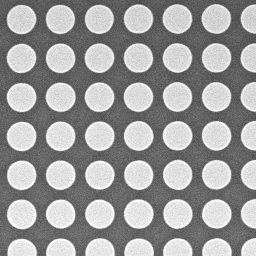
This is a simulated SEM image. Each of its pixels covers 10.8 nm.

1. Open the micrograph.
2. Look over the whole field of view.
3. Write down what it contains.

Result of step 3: an array of small figures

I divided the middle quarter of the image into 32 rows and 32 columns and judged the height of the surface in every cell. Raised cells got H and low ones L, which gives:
HHLLLLHHHHHHLLLLHHHHHHLLLHHHHHHL
HLLLLLLHHHHLLLLLLHHHHLLLLLHHHHLL
LLLLLLLLLLLLLLLLLLLLLLLLLLLLLLLL
LLLLLLLLLLLLLLLLLLLLLLLLLLLLLLLL
LLLLLLLLLLLLLLLLLLLLLLLLLLLLLLLL
HLLLLLLHHHHLLLLLHHHHHLLLLLHHHHHL
HHLLLLHHHHHHLLLLHHHHHHLLLHHHHHHL
HHHLLHHHHHHHLLLHHHHHHHLLLHHHHHHH
HHHLLHHHHHHHLLLHHHHHHHLLLHHHHHHH
HHHLLLHHHHHHLLLHHHHHHHLLLHHHHHHH
HHLLLLHHHHHHLLLLHHHHHLLLLLHHHHHL
HLLLLLLHHHLLLLLLLHHHLLLLLLLHHHLL
LLLLLLLLLLLLLLLLLLLLLLLLLLLLLLLL
LLLLLLLLLLLLLLLLLLLLLLLLLLLLLLLL
LLLLLLLLLLLLLLLLLLLLLLLLLLLLLLLL
HHLLLLHHHHHLLLLLHHHHHLLLLLHHHHHL
HHLLLLHHHHHHLLLHHHHHHHLLLHHHHHHH
HHHLLHHHHHHHLLLHHHHHHHLLLHHHHHHH
HHHLLHHHHHHHLLLHHHHHHHLLLHHHHHHH
HHLLLLHHHHHHLLLHHHHHHHLLLHHHHHHH
HHLLLLHHHHHHLLLLHHHHHLLLLLHHHHHL
LLLLLLLLHHLLLLLLLLHLLLLLLLLLLLLL
LLLLLLLLLLLLLLLLLLLLLLLLLLLLLLLL
LLLLLLLLLLLLLLLLLLLLLLLLLLLLLLLL
HLLLLLLLHHLLLLLLLHHHLLLLLLLHHHLL
HHLLLLHHHHHHLLLLHHHHHLLLLLHHHHHL
HHHLLLHHHHHHLLLHHHHHHHLLLHHHHHHH
HHHLLHHHHHHHLLLHHHHHHHLLLHHHHHHH
HHHLLLHHHHHHLLLHHHHHHHLLLHHHHHHH
HHLLLLHHHHHHLLLLHHHHHHLLLHHHHHHL
HHLLLLLHHHHLLLLLLHHHHLLLLLHHHHHL
LLLLLLLLLLLLLLLLLLLLLLLLLLLLLLLL